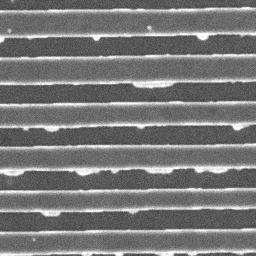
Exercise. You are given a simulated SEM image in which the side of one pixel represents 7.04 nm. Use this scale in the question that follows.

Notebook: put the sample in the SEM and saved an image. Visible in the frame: lines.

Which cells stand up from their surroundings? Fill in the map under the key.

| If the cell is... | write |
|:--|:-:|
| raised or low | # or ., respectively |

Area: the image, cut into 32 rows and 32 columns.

................................
################################
################################
################################
#################...............
................................
................................
################################
################################
################################
#######..#......................
................................
................................
################################
################################
##############################..
................................
................................
################################
################################
################################
................................
................................
................................
################################
################################
................................
................................
................................
################################
################################
##########################...#..